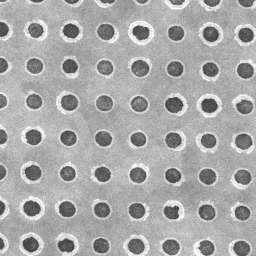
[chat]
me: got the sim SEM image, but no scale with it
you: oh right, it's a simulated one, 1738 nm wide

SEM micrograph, a regular array of holes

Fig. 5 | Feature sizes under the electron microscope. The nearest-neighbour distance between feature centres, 34.9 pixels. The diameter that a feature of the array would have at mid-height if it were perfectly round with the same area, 16.9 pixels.